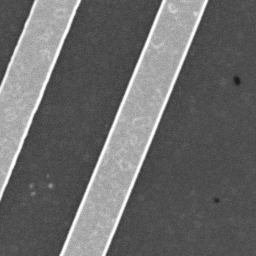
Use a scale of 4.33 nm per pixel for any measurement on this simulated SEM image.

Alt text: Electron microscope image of one or a few lines or trenches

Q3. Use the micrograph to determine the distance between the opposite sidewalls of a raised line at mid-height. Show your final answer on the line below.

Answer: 171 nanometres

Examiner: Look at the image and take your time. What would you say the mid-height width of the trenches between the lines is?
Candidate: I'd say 342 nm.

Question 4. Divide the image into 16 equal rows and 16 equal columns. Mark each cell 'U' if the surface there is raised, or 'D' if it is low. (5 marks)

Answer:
DDUUUDDDDDUUUDDD
DDUUDDDDDDUUDDDD
DUUUDDDDDUUUDDDD
DUUUDDDDDUUDDDDD
UUUDDDDDUUUDDDDD
UUUDDDDDUUUDDDDD
UUDDDDDDUUDDDDDD
UUDDDDDUUUDDDDDD
UUDDDDDUUDDDDDDD
UDDDDDUUUDDDDDDD
UDDDDDUUUDDDDDDD
DDDDDDUUDDDDDDDD
DDDDDUUUDDDDDDDD
DDDDDUUDDDDDDDDD
DDDDUUUDDDDDDDDD
DDDDUUUDDDDDDDDD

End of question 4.